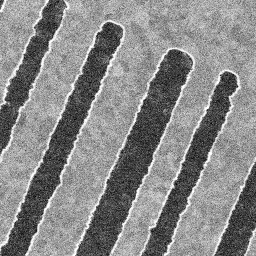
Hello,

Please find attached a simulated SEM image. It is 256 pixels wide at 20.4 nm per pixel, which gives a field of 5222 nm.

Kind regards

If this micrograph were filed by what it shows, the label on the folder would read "one or a few lines or trenches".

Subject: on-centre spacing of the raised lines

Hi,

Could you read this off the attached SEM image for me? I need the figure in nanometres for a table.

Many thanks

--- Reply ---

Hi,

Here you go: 1330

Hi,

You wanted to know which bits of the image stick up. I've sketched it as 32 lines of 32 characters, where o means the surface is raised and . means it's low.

oooooo..oooooooooooooooooooooooo
ooooo...oooooooooooooooooooooooo
ooooo...oooooooooooooooooooooooo
oooo...oooooo..ooooooooooooooooo
oooo...ooooo...ooooooooooooooooo
ooo...oooooo...ooooooooooooooooo
ooo...ooooo...ooooooo..ooooooooo
ooo..oooooo...oooooo....oooooooo
oo...ooooo....oooooo....oooooooo
oo...ooooo...oooooo.....oooo..oo
o...ooooo....oooooo....oooo...oo
o...ooooo...oooooo.....oooo..ooo
o..ooooo....oooooo....oooo...ooo
...ooooo...oooooo.....oooo...ooo
..oooooo...oooooo....oooo...oooo
..ooooo...ooooooo....oooo...oooo
.oooooo...oooooo.....ooo....oooo
.ooooo....oooooo....oooo...ooooo
.ooooo...oooooo.....oooo...ooooo
ooooo....oooooo....oooo...oooooo
ooooo...oooooo.....oooo...oooooo
oooo....oooooo.....ooo...oooooo.
oooo....ooooo.....oooo...oooooo.
oooo...oooooo....oooo...oooooo..
ooo....oooooo....oooo...oooooo..
ooo...oooooo.....oooo...ooooo...
oo....oooooo....oooo...oooooo...
oo...oooooo.....oooo..ooooooo...
oo...oooooo....oooo...oooooo....
o...oooooo.....oooo...oooooo....
o...oooooo....oooo...oooooo....o
....ooooo.....oooo...oooooo....o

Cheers